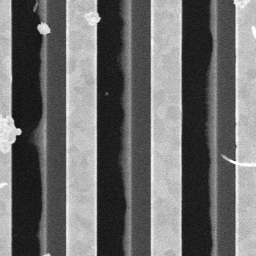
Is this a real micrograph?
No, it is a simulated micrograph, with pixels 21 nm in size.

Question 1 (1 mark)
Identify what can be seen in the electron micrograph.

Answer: lines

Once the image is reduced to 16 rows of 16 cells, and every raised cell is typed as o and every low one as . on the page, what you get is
o..ooo..ooo..ooo
o..ooo..ooo..ooo
o..ooo..ooo..ooo
o..ooo..ooo..ooo
o..ooo..ooo..ooo
o..ooo..ooo..ooo
o..ooo..ooo..ooo
o..ooo..ooo..ooo
o..ooo..ooo..ooo
o..ooo..ooo..ooo
o..ooo..ooo..ooo
o..ooo..ooo..ooo
o..ooo..ooo..ooo
o..ooo..ooo..ooo
o..ooo..ooo..ooo
o..ooo..ooo..ooo